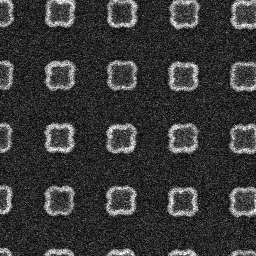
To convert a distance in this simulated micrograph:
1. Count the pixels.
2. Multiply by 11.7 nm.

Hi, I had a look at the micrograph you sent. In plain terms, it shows a regular array of raised bodies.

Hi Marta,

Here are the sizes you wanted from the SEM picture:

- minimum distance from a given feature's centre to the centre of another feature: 0.721 µm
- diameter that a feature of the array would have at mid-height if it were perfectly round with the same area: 342 nm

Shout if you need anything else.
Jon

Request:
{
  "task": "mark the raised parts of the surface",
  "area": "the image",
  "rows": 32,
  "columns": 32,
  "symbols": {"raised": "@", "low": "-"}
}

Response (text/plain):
@@----@@@-----@@@-----@@@----@@@
@@----@@@-----@@@----@@@@----@@@
@@----@@@-----@@@----@@@@----@@@
--------------------------------
--------------------------------
--------------------------------
--------------------------------
--------------------------------
@-----@@@-----@@@----@@@@----@@@
@-----@@@-----@@@----@@@@----@@@
@-----@@@-----@@@----@@@@----@@@
--------------------------------
--------------------------------
--------------------------------
--------------------------------
--------------------------------
@-----@@@----@@@@----@@@@----@@@
@-----@@@-----@@@----@@@@----@@@
@-----@@@-----@@@----@@@-----@@@
--------------------------------
--------------------------------
--------------------------------
--------------------------------
@-----@@@-----@@----------------
@-----@@@----@@@@----@@@-----@@@
@-----@@@-----@@@----@@@@----@@@
@-----@@@-----@@-----@@@-----@@@
--------------------------------
--------------------------------
--------------------------------
--------------------------------
@-----@@@-----@@------@@-----@@@